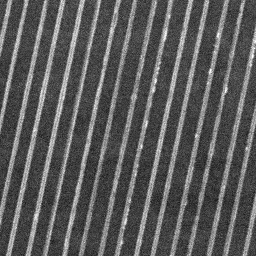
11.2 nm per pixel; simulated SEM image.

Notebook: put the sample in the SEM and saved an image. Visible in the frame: parallel lines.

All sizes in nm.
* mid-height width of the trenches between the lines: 163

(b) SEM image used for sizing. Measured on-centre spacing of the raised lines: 0.198 microns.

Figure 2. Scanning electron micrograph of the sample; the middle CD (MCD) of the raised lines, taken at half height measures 34.3 nanometres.